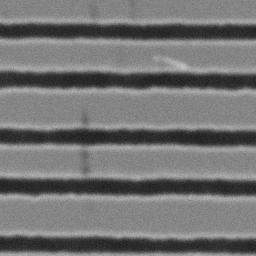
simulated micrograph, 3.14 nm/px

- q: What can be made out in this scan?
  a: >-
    lines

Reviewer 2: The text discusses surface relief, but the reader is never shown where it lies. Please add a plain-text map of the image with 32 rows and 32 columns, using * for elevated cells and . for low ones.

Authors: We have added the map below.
********************************
********************************
********************************
................................
................................
********************************
********************************
********************************
********************************
................................
................................
********************************
********************************
********************************
********************************
********************************
................................
................................
********************************
********************************
********************************
********************************
................................
................................
****.********.......*****.......
********************************
********************************
********************************
********************************
......*.*.....******************
................................
................................